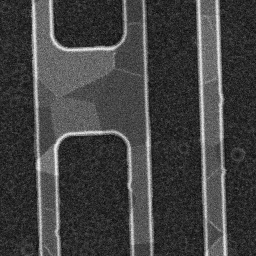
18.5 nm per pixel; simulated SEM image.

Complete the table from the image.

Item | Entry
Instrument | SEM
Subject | one or a few lines or trenches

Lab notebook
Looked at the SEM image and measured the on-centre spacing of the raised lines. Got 1530 nanometres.